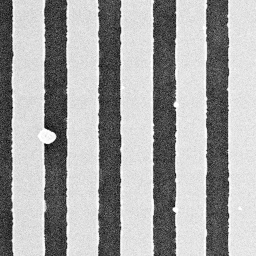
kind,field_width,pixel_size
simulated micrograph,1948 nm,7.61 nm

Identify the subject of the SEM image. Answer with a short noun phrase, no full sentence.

lines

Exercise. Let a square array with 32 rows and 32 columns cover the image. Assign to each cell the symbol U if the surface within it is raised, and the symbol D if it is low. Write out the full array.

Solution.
DDUUUUDDUUUUDDDUUUUDDDUUUUDDDUUU
DDUUUDDDUUUUDDDUUUUDDDUUUUDDDUUU
DDUUUDDDUUUUDDDUUUUDDDUUUUDDDUUU
DDUUUUDDUUUUDDDUUUUDDDUUUUDDDUUU
DDUUUUDDUUUUDDDUUUUDDDUUUUDDDUUU
DDUUUUDDUUUUDDDUUUUDDDUUUUDDDUUU
DDUUUUDDUUUUDDDUUUUDDDUUUUDDDUUU
DDUUUUDDUUUUDDDUUUUDDDUUUUDDDUUU
DDUUUDDDUUUUDDDUUUUDDDUUUUDDDUUU
DDUUUDDDDUUUDDDUUUUDDDUUUUDDDUUU
DDUUUDDDUUUUDDDUUUUDDDUUUUDDDUUU
DDUUUUDDUUUUDDDUUUUDDDUUUUDDDUUU
DDUUUUDDDUUUDDDUUUUDDDUUUUDDDUUU
DDUUUDDDDUUUDDDUUUUDDDUUUUDDDUUU
DDUUUUDDUUUUDDDUUUUDDDUUUUDDDUUU
DDUUUDDDUUUUDDDUUUUDDDUUUUDDDUUU
DDUUUUDDUUUUDDDUUUUDDDUUUUDDDUUU
DDUUUUUDUUUUDDDUUUUDDDUUUUDDDUUU
DDUUUDDDDUUUDDDUUUUDDDUUUUDDDUUU
DDUUUDDDUUUUDDDUUUUDDDUUUUDDDUUU
DDUUUDDDUUUUDDDUUUUDDDUUUUDDDUUU
DDUUUUDDUUUUDDDUUUUDDDUUUUDDDUUU
DDUUUUDDUUUUDDDUUUUDDDUUUUDDDUUU
DDUUUUDDUUUUDDDUUUUDDDUUUUDDDUUU
DDUUUDDDUUUUDDDUUUUDDDUUUUDDDUUU
DDUUUDDDUUUUDDDUUUUDDDUUUUDDDUUU
DDUUUDDDUUUUDDDUUUUDDDUUUUDDDUUU
DDUUUDDDUUUUDDDUUUUDDDUUUUDDDUUU
DDUUUDDDUUUUDDDUUUUDDDUUUUDDDUUU
DDUUUUDDUUUUDDDUUUUDDDUUUUDDDUUU
DDUUUUDDDUUUDDDUUUUDDDUUUUDDDUUU
DDUUUUDDUUUUDDDUUUUDDDUUUUDDDUUU